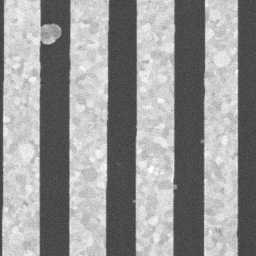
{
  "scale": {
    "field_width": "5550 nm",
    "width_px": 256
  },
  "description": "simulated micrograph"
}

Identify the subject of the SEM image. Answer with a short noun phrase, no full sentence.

lines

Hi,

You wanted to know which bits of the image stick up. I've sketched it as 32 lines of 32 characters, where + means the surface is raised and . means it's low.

.++++....+++++...+++++....++++..
.++++....+++++...+++++....++++..
.++++....+++++...+++++....++++..
.++++....+++++...+++++....++++..
.++++....++++....+++++....++++..
.++++....++++....+++++....++++..
.++++....++++....+++++....++++..
.++++....++++....+++++....++++..
.++++....++++....+++++....++++..
.++++....++++....+++++....++++..
+++++....++++....+++++....++++..
+++++....++++....+++++....++++..
+++++....++++....+++++....++++..
+++++....++++....+++++....++++..
+++++....++++....+++++....++++..
+++++....++++....+++++....++++..
+++++....++++....+++++....++++..
+++++....++++....+++++....++++..
+++++....++++....+++++....++++..
+++++....++++....+++++....++++..
+++++....++++....+++++....++++..
+++++....++++....+++++....++++..
+++++....++++....+++++....++++..
+++++....++++....+++++....++++..
+++++....++++....+++++....++++..
+++++....++++....+++++....++++..
+++++....++++....+++++....++++..
+++++....++++....+++++....++++..
+++++....++++....+++++....++++..
+++++....++++....+++++....++++..
+++++....++++....+++++....++++..
+++++....++++....+++++....++++..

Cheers